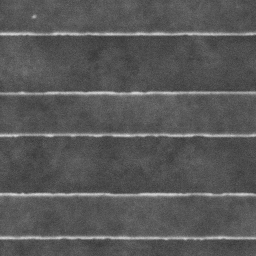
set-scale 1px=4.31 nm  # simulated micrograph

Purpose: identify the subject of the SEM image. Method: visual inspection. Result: lines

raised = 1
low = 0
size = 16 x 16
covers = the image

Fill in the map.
1111111111111111
1111111111111111
0000000000000000
0000000000000000
0000000000000000
0000000000000000
1111111111111111
1111111111111111
1111111111111111
0000000000000000
0000000000000000
0000000000000000
1111111111111111
1111111111111111
1111111111111111
0000000000000000